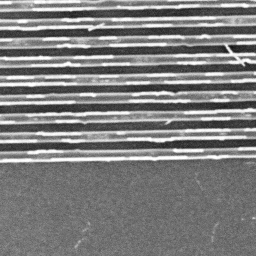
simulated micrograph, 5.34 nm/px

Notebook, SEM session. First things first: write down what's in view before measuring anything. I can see parallel lines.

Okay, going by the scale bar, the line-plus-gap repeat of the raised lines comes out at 18.9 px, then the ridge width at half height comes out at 50.7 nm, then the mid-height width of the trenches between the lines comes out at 9.49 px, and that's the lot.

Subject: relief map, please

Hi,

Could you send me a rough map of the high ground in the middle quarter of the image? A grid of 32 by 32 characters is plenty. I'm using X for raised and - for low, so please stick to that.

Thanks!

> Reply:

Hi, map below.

X-XX----------------------------
--------------------------------
-------------------------XXX----
XXXXXXXXXXXXXXXXXXXXXXXXXXXXXXXX
XXXXXXXXXXXXXXXXXXXXXXXXXXXXXXXX
--------------------------------
--------------------------------
----XXXX----XXXXXXXXXXXXXXXXXXXX
XXXXXXXXXXXXXXXXXXXXXXXXXXXXXXXX
XXXXXXXXXXXXXXXXXXX------XXXXXX-
--------------------------------
--------------------------------
XXXXXXXXXXXXXXXXXXXXXXXXXXXXXXXX
XXXXXXXXXXXXXXXXXXXXXXXXXXXXXXXX
XXXXXX--------------------------
--------------------------------
------------------------------XX
XXXXXXXXXXXXXXXXXXXXXXXXXXXXXXXX
XXXXXXXXXXXXXXXXXXXXXXXXXXXXXXXX
-XXX----------------------------
--------------------------------
---------------------------XXXXX
XXXXXXXXXXXXXXXXXXXXXXXXXXXXXXXX
XXXXXXXXXXXXXXXXXXXXXXXXXXXXXXXX
--------------------------------
--------------------------------
--------------------------------
--------------------------------
--------------------------------
--------------------------------
--------------------------------
--------------------------------